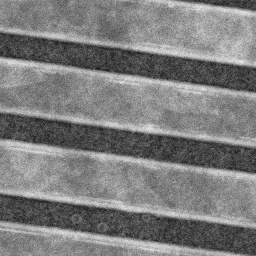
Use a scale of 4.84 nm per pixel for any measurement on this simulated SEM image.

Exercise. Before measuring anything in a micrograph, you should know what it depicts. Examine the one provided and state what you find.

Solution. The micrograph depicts one or a few lines or trenches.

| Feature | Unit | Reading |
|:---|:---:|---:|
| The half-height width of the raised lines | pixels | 48.9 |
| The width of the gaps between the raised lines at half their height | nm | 154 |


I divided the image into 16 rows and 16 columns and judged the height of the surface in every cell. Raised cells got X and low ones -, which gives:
XXXXXXXXXXXXX---
XXXXXXXXXXXXXXXX
-----XXXXXXXXXXX
------------XXXX
XXXXX-----------
XXXXXXXXXXXXX---
XXXXXXXXXXXXXXXX
-----XXXXXXXXXXX
------------XXXX
XXXXX-----------
XXXXXXXXXXXX----
XXXXXXXXXXXXXXXX
----XXXXXXXXXXXX
------------XXXX
XXXX------------
XXXXXXXXXXX-----